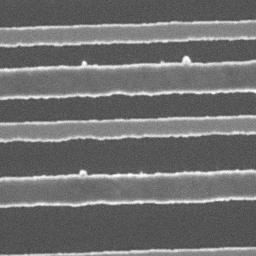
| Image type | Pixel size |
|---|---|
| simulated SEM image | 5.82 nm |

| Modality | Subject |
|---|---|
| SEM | lines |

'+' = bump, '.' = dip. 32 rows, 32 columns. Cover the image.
................................
................................
................................
...+++++++++++++++++++++++++++++
++++++++++++++++++++++++++++++++
+++++++++.......................
................................
.......................+........
......++++++++++++++++++++++++++
++++++++++++++++++++++++++++++++
++++++++++++++++++++++++++++++++
+++++++++++++++++++++++++++++...
................................
................................
................................
.+++++++++++++++++++++++++++++++
++++++++++++++++++++++++++++++++
++++++++........................
................................
................................
................................
...........................+++++
++++++++++++++++++++++++++++++++
++++++++++++++++++++++++++++++++
++++++++++++++++++++++++++++++++
+++++++++++.....................
................................
................................
................................
................................
................................
...............+++++++++++++++++